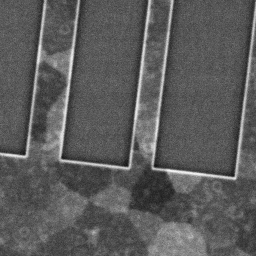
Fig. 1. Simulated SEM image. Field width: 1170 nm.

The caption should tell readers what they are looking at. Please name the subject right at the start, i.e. one or a few lines or trenches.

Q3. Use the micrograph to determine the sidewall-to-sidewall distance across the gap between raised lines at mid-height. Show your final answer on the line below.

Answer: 318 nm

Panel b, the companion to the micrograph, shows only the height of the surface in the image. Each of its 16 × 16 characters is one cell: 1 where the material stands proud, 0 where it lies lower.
0001100001100000
0001100001100000
0001100001000000
0011100001000000
0011000001000001
0011000001000001
0011000001000001
0011000011000001
0011000011000001
0011000011000001
1111111111000001
1111111111111111
1111111111111111
1111111111111111
1111111111111111
1111111111111111